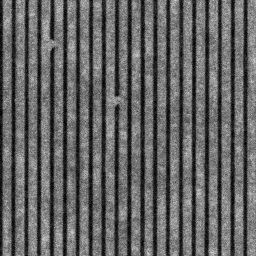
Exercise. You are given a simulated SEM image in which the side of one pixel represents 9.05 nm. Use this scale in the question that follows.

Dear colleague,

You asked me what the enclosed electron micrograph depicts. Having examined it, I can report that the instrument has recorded parallel lines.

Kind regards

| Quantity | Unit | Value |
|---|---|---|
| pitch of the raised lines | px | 12.9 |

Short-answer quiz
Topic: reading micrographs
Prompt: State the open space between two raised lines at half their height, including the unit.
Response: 47.5 nm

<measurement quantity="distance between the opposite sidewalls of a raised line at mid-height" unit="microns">0.0724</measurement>